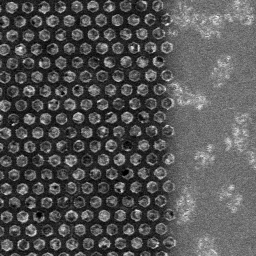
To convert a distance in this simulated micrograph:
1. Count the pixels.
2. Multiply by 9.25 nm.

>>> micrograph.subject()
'a regular array of raised bodies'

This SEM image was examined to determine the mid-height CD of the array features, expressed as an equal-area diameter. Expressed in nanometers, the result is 103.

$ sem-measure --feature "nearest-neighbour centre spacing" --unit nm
147